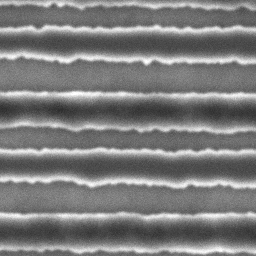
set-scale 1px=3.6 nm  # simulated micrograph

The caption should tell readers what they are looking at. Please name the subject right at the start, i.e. lines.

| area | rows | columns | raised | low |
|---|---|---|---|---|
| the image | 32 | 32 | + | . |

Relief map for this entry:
+++.++.+++++++++++++++++++++++++
................................
................................
...+.++++.+......+.+.........++.
++++++++++++++++++++++++++++++++
++++++++++++++++++++++++++++++++
++++++++++++++++++++++++++++++++
.......++.....+.+++.++++++++++++
................................
................................
................................
...+............................
++++++++++++++++++++++++++++++++
++++++++++++++++++++++++++++++++
++++++++++++++++++++++++++++++++
++++++++++++++++++++++++++++++++
...........................++...
................................
................................
++++++++++++++++++++++++++++++++
++++++++++++++++++++++++++++++++
++++++++++++++++++++++++++++++++
+++++++.++++++++++++++++++++++++
................................
................................
................................
................................
++++++++++++++++++++++++++++++++
++++++++++++++++++++++++++++++++
++++++++++++++++++++++++++++++++
++++++++++++++++++++++++++++++++
........................++...+.+